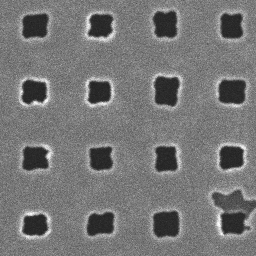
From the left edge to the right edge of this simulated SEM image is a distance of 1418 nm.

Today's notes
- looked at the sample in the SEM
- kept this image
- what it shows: a regular array of holes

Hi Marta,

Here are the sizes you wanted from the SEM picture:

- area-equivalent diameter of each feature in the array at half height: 143 nm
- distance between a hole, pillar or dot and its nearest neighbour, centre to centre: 362 nm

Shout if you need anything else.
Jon